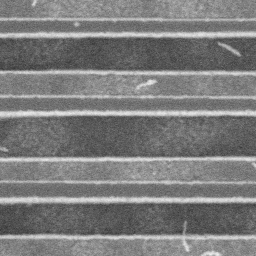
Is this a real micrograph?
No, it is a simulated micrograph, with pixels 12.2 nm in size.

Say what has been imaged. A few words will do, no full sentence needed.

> lines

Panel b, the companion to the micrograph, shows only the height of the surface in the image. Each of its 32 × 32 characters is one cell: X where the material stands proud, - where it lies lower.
XXXXXXXXXXXXXXXXXXXXXXXXXXXXXXXX
XXXXXXXXXXXXXXXXXXXXXXXXXXXXXXXX
XXXXXXXXXXXXXXXXXXXXXXXXXXXXXXXX
XXXXXXXXXXXXXXXXXXXXXXXXXXXXXXXX
--------------------------------
--------------------------------
--------------------------------
--------------------------------
--------------------------------
XXXXXXXXXXXXXXXXXXXXXXXXXXXXXXXX
XXXXXXXXXXXXXXXXXXXXXXXXXXXXXXXX
XXXXXXXXXXXXXXXXXXXXXXXXXXXXXXXX
XXXXXXXXXXXXXXXXXXXXXXXXXXXXXXXX
XXXXXXXXXXXXXXXXXXXXXXXXXXXXXXXX
--------------------------------
--------------------------------
--------------------------------
--------------------------------
--------------------------------
--------------------------------
XXXXXXXXXXXXXXXXXXXXXXXXXXXXXXXX
XXXXXXXXXXXXXXXXXXXXXXXXXXXXXXXX
XXXXXXXXXXXXXXXXXXXXXXXXXXXXXXXX
XXXXXXXXXXXXXXXXXXXXXXXXXXXXXXXX
XXXXXXXXXXXXXXXXXXXXXXXXXXXXXXXX
--------------------------------
--------------------------------
--------------------------------
--------------------------------
--------------------------------
XXXXXXXXXXXXXXXXXXXXXXXXXXXXXXXX
XXXXXXXXXXXXXXXXXXXXXXXXXXXXXXXX